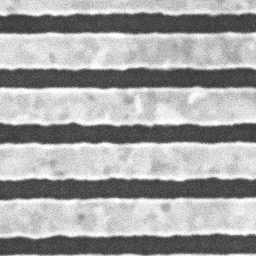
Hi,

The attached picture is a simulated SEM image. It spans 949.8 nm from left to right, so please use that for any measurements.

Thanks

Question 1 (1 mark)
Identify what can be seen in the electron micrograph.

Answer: lines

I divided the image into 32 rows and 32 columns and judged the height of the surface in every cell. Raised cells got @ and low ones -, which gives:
@@@@@@@@@@@@@@@@@@@@@@@@@@@@@@@@
@@@@@@@@@@@@@@@@@@@@@@@@@@@@@@@@
--------------------------------
--------------------------------
@@@@@@@@@@@@@@@@@@@@@@@@@@@@@@@@
@@@@@@@@@@@@@@@@@@@@@@@@@@@@@@@@
@@@@@@@@@@@@@@@@@@@@@@@@@@@@@@@@
@@@@@@@@@@@@@@@@@@@@@@@@@@@@@@@@
-@---@-@@@-@@@@@--------@@@@----
--------------------------------
--------------------------------
@@@@@@@@@@@@@@@@@@@@@@@@@@@@@@@@
@@@@@@@@@@@@@@@@@@@@@@@@@@@@@@@@
@@@@@@@@@@@@@@@@@@@@@@@@@@@@@@@@
@@@@@@@@@@@@@@@@@@@@@@@@@@@@@@@@
-@@--@@---@@@-@@@-@-----@@@@@---
--------------------------------
--------------------------------
@@@@@@@@@@@@@@@@@@@@@@@@@@@@@@@@
@@@@@@@@@@@@@@@@@@@@@@@@@@@@@@@@
@@@@@@@@@@@@@@@@@@@@@@@@@@@@@@@@
@@@@@@@@@@@@@@@@@@@@@@@@@@@@@@@@
----------------------@---------
--------------------------------
--------------------------------
@@@@@@@@@@@@@@@@@@@@@@@@@@@@@@@@
@@@@@@@@@@@@@@@@@@@@@@@@@@@@@@@@
@@@@@@@@@@@@@@@@@@@@@@@@@@@@@@@@
@@@@@@@@@@@@@@@@@@@@@@@@@@@@@@@@
@@-@@@--------------------------
--------------------------------
--------------------------------